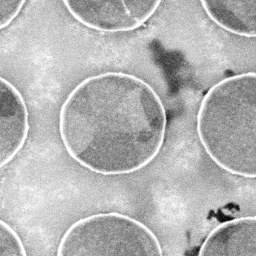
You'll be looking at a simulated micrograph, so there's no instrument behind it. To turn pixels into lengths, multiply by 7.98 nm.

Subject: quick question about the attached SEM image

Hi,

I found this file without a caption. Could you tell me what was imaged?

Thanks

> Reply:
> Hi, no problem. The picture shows raised bodies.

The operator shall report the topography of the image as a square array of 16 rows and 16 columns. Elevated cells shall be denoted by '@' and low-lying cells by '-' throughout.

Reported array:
@---@@@@@@---@@@
-----@@@@-----@@
----------------
----------------
----------------
@----@@@@----@@@
@---@@@@@@---@@@
@@--@@@@@@--@@@@
@@--@@@@@@---@@@
@---@@@@@@---@@@
------@@@-----@@
----------------
----------------
------@@--------
@---@@@@@----@@@
@---@@@@@@---@@@